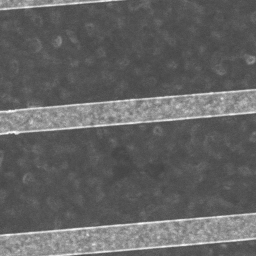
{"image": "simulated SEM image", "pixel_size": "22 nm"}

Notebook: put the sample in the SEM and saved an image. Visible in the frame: one or a few lines or trenches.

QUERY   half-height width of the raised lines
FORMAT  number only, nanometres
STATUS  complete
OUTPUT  528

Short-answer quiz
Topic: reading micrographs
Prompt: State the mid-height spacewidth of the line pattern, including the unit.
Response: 2200 nm